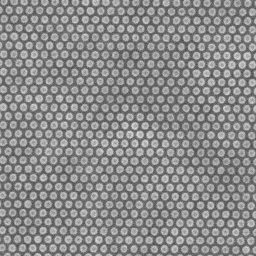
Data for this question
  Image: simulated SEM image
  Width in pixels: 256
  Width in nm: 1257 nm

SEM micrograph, a regular array of raised bodies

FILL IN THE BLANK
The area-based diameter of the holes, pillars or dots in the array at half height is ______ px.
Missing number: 7.05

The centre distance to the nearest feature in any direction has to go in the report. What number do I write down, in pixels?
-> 9.86